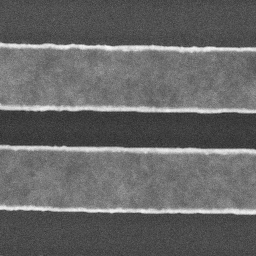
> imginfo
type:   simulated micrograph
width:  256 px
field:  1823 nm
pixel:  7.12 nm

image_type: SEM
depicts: lines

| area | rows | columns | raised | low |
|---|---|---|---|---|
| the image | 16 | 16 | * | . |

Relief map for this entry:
................
................
................
****************
****************
****************
****************
................
................
****************
****************
****************
****************
................
................
................